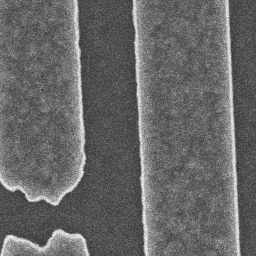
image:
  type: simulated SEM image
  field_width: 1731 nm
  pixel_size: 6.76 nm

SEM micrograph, one or a few lines or trenches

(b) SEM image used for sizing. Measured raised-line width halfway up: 630 nm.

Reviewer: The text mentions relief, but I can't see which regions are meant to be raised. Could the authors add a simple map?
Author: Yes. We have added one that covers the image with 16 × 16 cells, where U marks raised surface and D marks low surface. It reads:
UUUUUDDDUUUUUUDD
UUUUUDDDUUUUUUDD
UUUUUDDDDUUUUUDD
UUUUUDDDDUUUUUDD
UUUUUDDDDUUUUUDD
UUUUUDDDDUUUUUDD
UUUUUDDDDUUUUUDD
UUUUUDDDDUUUUUUD
UUUUUDDDDUUUUUUD
UUUUUDDDDUUUUUUD
UUUUUDDDDUUUUUUD
UUUUUDDDDUUUUUUD
DDDUDDDDDUUUUUUD
DDDDDDDDDUUUUUUD
DDDDDDDDDUUUUUUD
UUUUUDDDDUUUUUUD